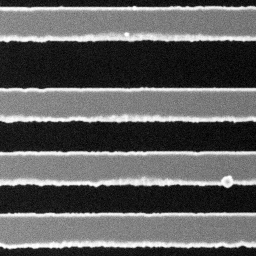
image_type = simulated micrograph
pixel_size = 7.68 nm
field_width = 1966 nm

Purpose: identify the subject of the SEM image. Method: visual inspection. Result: lines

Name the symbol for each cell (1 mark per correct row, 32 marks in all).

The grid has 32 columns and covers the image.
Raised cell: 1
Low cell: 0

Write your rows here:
00000000000000000000000000000000
11111111111111111111111111111111
11111111111111111111111111111111
11111111111111111111111111111111
11111111111111111111111111111111
00000000000000000000000000000000
00000000000000000000000000000000
00000000000000000000000000000000
00000000000000000000000000000000
00000000000000000000000000000000
00000000000000000000000000000000
11111111111111111111111111111111
11111111111111111111111111111111
11111111111111111111111111111111
11111111111111111111111111111111
00000000000000000000000000000000
00000000000000000000000000000000
00000000000000000000000000000000
00000000000000000000000000000000
11111111111111111111111111111111
11111111111111111111111111111111
11111111111111111111111111111111
11111111111111111111111111111111
00000000000000000000000000000000
00000000000000000000000000000000
00000000000000000000000000000000
00000000000000000000000000000000
11111111111111111111111111111111
11111111111111111111111111111111
11111111111111111111111111111111
11111111111111111111111111111111
00000000000000000000000000000000